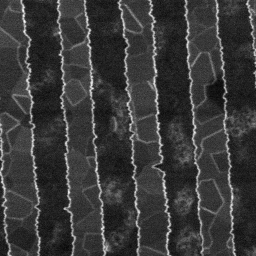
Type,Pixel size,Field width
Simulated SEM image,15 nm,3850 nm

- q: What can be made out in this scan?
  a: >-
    one or a few lines or trenches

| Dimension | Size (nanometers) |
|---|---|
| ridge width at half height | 452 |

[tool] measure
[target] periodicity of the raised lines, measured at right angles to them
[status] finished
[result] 0.973 µm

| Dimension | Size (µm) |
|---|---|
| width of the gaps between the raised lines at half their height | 0.518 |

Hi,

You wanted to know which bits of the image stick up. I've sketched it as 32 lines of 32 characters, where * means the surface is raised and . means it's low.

***....****....****....****....*
***....****....****....****....*
***....****....****....****....*
***....****....****....****.....
***.....***.....***....****.....
****....***.....***....*****....
***.....***.....***.....****....
***.....***.....***....*****....
****....***.....***.....****....
****....***.....***.....****....
****....***.....***.....****....
****....***.....****....****....
****....****....****....****....
****....****....****....****....
****....****....****....****....
****....****....****....****....
****....****....****....****....
****....****....****....****....
****....****.....***....****....
****....****.....***....*****...
****....****.....***.....****...
****....****.....***.....****...
****....****.....***.....****...
.****....****....****....****...
.****....***.....****....****...
.****....****....****....****...
.****....****....****....****...
.****....****....****....****...
.****....****....****....****...
.****....****....****....****...
.****....****....****....****...
.****....****....****....****...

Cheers